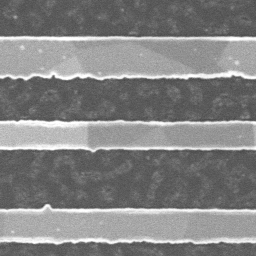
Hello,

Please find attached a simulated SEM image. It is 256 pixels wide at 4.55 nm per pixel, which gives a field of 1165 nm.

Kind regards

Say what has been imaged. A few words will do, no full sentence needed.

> one or a few lines or trenches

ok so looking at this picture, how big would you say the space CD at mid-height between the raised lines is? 0.237 microns